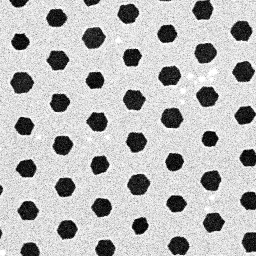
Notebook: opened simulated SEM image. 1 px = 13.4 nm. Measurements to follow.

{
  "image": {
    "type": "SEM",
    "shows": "a regular array of holes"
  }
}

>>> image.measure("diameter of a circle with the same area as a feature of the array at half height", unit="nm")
274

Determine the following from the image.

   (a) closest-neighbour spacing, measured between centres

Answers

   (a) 561 nanometres